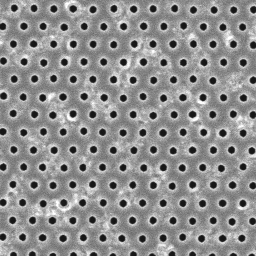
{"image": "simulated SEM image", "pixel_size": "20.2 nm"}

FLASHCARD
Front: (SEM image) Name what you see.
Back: a regular array of holes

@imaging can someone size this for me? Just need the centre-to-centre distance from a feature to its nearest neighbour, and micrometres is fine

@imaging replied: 0.389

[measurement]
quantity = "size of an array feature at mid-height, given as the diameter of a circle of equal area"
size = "151 nanometers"